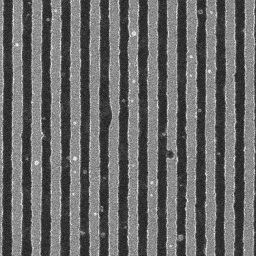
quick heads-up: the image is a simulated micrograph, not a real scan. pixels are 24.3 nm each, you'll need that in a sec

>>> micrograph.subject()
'parallel lines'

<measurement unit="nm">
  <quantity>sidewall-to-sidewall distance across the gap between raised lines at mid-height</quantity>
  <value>203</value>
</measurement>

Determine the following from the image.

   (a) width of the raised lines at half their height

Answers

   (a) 0.264 µm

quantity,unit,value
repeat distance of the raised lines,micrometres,0.47